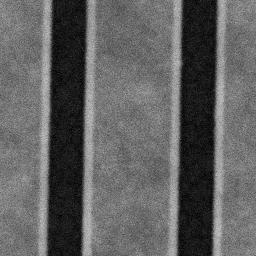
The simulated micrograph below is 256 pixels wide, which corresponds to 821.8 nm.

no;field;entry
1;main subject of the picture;one or a few lines or trenches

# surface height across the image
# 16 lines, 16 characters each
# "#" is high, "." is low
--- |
###...#####...##
###...#####...##
###...#####...##
###...#####...##
###...#####...##
###...#####...##
###...#####...##
###...#####...##
###...#####...##
###...#####...##
###...#####...##
###...#####...##
###..######...##
###..######...##
###..######...##
###..######...##